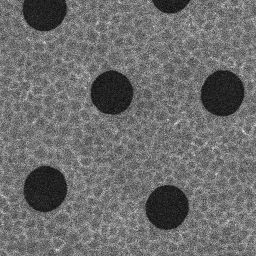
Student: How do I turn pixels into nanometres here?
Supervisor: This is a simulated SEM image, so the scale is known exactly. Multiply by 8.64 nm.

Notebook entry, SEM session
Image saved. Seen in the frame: holes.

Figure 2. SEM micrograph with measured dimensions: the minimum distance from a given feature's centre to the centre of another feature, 984 nm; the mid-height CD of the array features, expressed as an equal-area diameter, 382 nanometres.